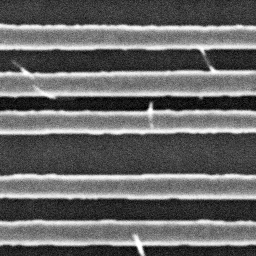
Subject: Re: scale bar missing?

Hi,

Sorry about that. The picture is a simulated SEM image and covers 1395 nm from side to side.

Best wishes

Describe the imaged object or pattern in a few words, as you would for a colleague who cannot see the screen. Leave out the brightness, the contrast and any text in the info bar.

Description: lines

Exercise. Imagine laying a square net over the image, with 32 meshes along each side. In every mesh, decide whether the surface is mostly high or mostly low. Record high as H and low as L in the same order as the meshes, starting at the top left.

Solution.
LLLLLLLLLLLLLLLLLLLLLLLLLLLLLLLL
LLLLLLLLLLLLLLLLLLLLLLLLLLLLLLLL
LLLLLLLLLLLLLLLLLLLLLLLLLLLLLLLL
HHHHHHHHHHHHHHHHHHHHHHHHHHHHHHHH
HHHHHHHHHHHHHHHHHHHHHHHHHHHHHHHH
HHHHHHHHHHHHHHHHHHHHHHHHHHHHHHHH
LLLLLLLLLLLLLLLLLLLLLLLLLLLLLLLL
LLLLLLLLLLLLLLLLLLLLLLLLLLLLLLLL
LLLLLLLLLLLLLLLLLLLLLLLLLLLLLLLL
HHHHHHHHHHHHHHHHHHHHHHHHHHHHHHHH
HHHHHHHHHHHHHHHHHHHHHHHHHHHHHHHH
HHHHHHHHHHHHHHHHHHHHHHHHHHHHHHHH
LLLLLLLLLLLLLLLLLLLLLLLLLLLLLLLL
LLLLLLLLLLLLLLLLLLLLLLLLLLLLLLLL
HHHHHHHHHHHHHHHHHHHHHHHHHHHHHHHH
HHHHHHHHHHHHHHHHHHHHHHHHHHHHHHHH
HHHHHHHHHHHHHHHHHHHHHHLLHHLLLHLL
LLLLLLLLLLLLLLLLLLLLLLLLLLLLLLLL
LLLLLLLLLLLLLLLLLLLLLLLLLLLLLLLL
LLLLLLLLLLLLLLLLLLLLLLLLLLLLLLLL
LLLLLLLLLLLLLLLLLLLLLLLLLLLLLLLL
LLLLLLLLLLLLLLLLLLLLLLLLLLLLLLLL
HHHHHHHHHHHHHHHHHHHHHHHHHHHHHHHH
HHHHHHHHHHHHHHHHHHHHHHHHHHHHHHHH
HHHHHHHHHHHHHHHHHHHHHHHHHHHHHHHH
LLLLLLLLLLLLLLLLLLLLLLLLLLLLLLLL
LLLLLLLLLLLLLLLLLLLLLLLLLLLLLLLL
LLLLLLLLLLLLLLLLLLLLLLLLLLLLLLLL
HHHHHHHHHHHHHHHHHHHHHHHHHHHHHHHH
HHHHHHHHHHHHHHHHHHHHHHHHHHHHHHHH
LLLHHLLHHHHLLLHHHHHHHHLHHHHHLHHL
LLLLLLLLLLLLLLLLLLLLLLLLLLLLLLLL